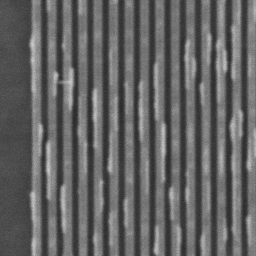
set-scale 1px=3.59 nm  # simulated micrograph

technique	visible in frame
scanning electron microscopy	parallel lines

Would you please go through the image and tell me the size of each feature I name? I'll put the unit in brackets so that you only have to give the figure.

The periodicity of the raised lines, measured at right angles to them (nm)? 55.3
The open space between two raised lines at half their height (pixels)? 7.63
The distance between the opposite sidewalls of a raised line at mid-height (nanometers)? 27.4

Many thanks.